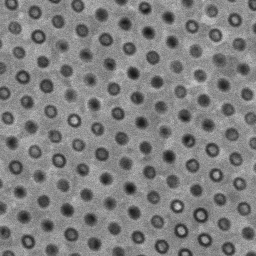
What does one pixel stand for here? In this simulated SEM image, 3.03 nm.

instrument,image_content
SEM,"a regular array of holes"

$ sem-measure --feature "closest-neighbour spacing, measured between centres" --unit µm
0.0751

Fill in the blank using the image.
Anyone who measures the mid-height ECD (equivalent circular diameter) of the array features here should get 44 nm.